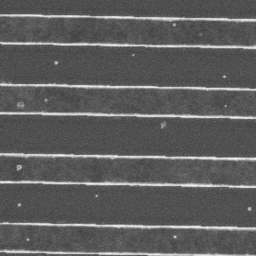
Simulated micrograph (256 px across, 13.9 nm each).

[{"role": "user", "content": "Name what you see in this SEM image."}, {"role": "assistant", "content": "lines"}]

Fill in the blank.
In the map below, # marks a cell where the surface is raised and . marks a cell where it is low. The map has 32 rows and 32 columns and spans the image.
................................
................................
##############################..
################################
################################
.........#######################
................................
................................
................................
................................
................................
################################
################################
################################
....................############
................................
................................
................................
................................
############....................
################################
################################
################################
................................
................................
................................
................................
................................
###########################.....
################################
################################
...#############################